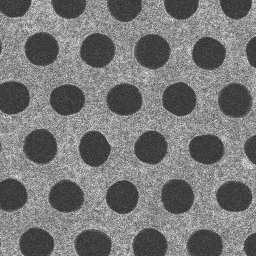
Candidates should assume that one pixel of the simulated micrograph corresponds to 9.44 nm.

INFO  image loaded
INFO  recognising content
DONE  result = a regular array of holes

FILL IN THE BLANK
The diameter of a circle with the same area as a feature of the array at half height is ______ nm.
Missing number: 318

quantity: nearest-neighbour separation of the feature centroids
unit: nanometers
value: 517